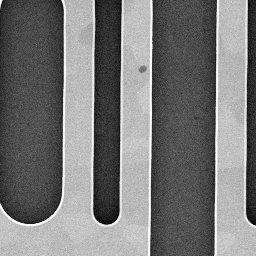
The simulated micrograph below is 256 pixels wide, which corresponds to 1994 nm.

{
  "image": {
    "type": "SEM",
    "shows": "groups of lines, slits or small figures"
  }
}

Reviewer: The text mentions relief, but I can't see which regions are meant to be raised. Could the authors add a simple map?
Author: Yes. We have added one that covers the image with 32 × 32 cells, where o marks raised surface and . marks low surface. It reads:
........oooo...oooo........oooo.
........oooo...oooo........oooo.
........oooo...oooo........oooo.
........oooo...oooo........oooo.
........oooo...oooo........oooo.
........oooo...oooo........oooo.
........oooo...oooo........oooo.
........oooo...oooo........oooo.
........oooo...oooo........oooo.
........oooo...oooo........oooo.
........oooo...oooo........oooo.
........oooo...oooo........oooo.
........oooo...oooo........oooo.
........oooo...oooo........oooo.
........oooo...oooo........oooo.
........oooo...oooo........oooo.
........oooo...oooo........oooo.
........oooo...oooo........oooo.
........oooo...oooo........oooo.
........oooo...oooo........oooo.
........oooo...oooo........oooo.
........oooo...oooo........oooo.
........oooo...oooo........oooo.
........oooo...oooo........oooo.
........oooo...oooo........oooo.
........ooo....oooo........oooo.
o......ooooo...oooo........oooo.
oo....oooooo...oooo........oooo.
ooooooooooooooooooo........ooooo
ooooooooooooooooooo........ooooo
ooooooooooooooooooo........ooooo
ooooooooooooooooooo........ooooo